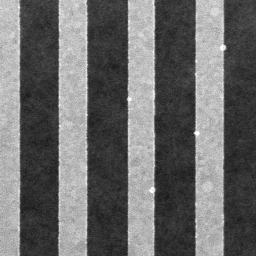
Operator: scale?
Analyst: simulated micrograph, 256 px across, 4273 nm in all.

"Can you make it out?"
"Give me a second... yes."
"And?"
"one or a few lines or trenches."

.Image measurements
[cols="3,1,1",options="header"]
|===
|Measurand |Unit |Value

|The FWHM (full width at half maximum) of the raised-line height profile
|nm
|455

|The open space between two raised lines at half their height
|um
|0.695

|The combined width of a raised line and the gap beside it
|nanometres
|1140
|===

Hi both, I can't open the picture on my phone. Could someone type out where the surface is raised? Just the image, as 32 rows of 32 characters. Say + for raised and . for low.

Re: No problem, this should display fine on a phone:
++.....++++.....+++......+++....
++.....++++.....+++......+++....
++.....++++.....+++......+++....
++.....++++.....+++......+++....
++.....++++.....+++.....++++....
++.....++++.....+++......+++....
++......+++.....+++......+++....
++.....++++.....+++......+++....
++.....++++.....+++......+++....
++.....++++.....+++.....++++....
++.....++++.....+++.....++++....
++.....++++.....+++.....++++....
++.....++++.....+++......+++....
++.....++++.....+++......+++....
++.....++++.....+++......+++....
++.....++++.....+++......+++....
++.....++++.....+++.....++++....
++.....++++.....+++......+++....
++.....++++.....+++......+++....
++.....++++.....+++......+++....
++.....++++.....+++......+++....
++.....++++.....+++......+++....
++.....++++.....+++......+++....
++.....++++.....+++......+++....
++.....++++.....+++......+++....
++.....++++.....+++.....++++....
++.....++++.....+++......+++....
++.....++++.....+++......+++....
++.....++++.....+++......+++....
++.....++++.....+++......+++....
++.....++++.....+++......+++....
++.....++++.....+++......+++....